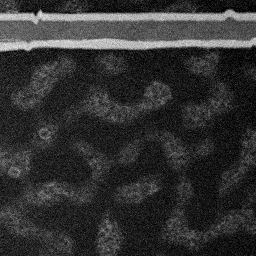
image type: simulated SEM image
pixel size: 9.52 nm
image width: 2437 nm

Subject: one or a few lines or trenches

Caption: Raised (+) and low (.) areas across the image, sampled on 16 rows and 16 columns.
................
++++++++++++++++
++++++++++++++++
................
................
................
................
................
................
................
................
................
................
................
................
................